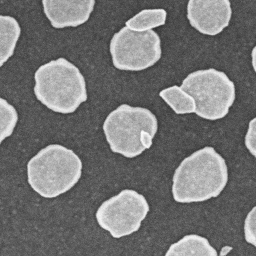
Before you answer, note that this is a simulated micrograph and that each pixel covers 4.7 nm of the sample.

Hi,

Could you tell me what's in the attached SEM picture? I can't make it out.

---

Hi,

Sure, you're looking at raised bodies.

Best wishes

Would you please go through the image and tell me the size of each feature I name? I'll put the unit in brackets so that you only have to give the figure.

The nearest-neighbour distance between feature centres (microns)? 0.384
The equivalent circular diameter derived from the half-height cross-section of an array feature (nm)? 241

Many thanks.